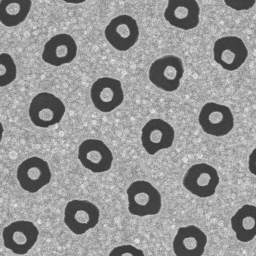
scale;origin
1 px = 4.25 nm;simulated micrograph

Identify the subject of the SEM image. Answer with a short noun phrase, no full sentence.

a regular array of ring-shaped grooves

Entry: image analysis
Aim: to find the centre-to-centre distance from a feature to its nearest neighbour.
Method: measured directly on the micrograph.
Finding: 259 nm